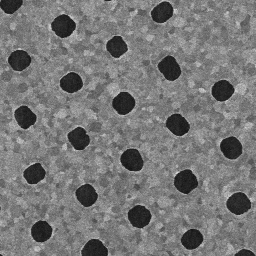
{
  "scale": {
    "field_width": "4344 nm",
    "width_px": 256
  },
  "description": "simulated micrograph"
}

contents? a regular array of holes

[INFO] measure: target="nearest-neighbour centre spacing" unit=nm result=958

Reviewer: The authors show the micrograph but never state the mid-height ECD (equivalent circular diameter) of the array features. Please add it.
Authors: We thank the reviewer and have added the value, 388 nanometers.